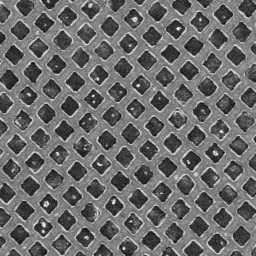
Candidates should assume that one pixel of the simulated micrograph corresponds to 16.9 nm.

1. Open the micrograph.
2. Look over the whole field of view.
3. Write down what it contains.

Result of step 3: a regular array of holes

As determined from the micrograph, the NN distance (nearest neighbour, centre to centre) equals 0.415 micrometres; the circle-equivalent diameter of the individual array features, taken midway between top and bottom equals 18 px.